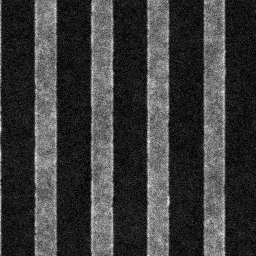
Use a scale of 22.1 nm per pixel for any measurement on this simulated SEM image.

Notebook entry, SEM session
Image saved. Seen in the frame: parallel lines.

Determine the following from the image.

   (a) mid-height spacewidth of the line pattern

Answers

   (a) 784 nm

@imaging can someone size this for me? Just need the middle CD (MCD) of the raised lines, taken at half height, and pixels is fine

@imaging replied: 19.6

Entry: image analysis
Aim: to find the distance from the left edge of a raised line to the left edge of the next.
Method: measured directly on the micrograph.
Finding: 1.24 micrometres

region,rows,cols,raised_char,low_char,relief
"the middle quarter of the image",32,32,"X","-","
-------XXXXX---------XXXXX------
-------XXXXX---------XXXXX------
-------XXXXX---------XXXXX------
-------XXXXX---------XXXXX------
-------XXXXX---------XXXXX------
-------XXXXX---------XXXXX------
-------XXXXX---------XXXXX------
-------XXXXX---------XXXXX------
-------XXXXX---------XXXXX------
-------XXXXX---------XXXXX------
-------XXXXX---------XXXXX------
-------XXXXX---------XXXXX------
-------XXXXX---------XXXXX------
-------XXXXX---------XXXXX------
-------XXXXX---------XXXXX------
-------XXXXX---------XXXXX------
-------XXXXX---------XXXXX------
-------XXXXX---------XXXXX------
-------XXXXX---------XXXXX------
-------XXXXX---------XXXXX------
-------XXXXX---------XXXXX------
-------XXXXX---------XXXXX------
-------XXXXX---------XXXXX------
-------XXXXX---------XXXXX------
-------XXXXX---------XXXXX------
-------XXXXX---------XXXXX------
-------XXXXX---------XXXXX------
-------XXXXX---------XXXXX------
-------XXXXX---------XXXXX------
-------XXXXX---------XXXXX------
-------XXXXX---------XXXXX------
-------XXXXX---------XXXXX------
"